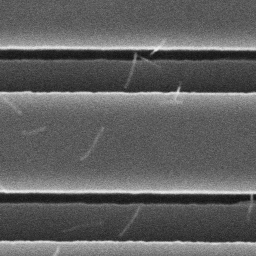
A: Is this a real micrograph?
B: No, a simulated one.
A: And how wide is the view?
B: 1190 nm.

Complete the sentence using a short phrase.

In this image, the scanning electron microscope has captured lines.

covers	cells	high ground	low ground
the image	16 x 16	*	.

****************
****************
****************
................
................
................
****************
****************
****************
****************
****************
****************
................
................
................
****************